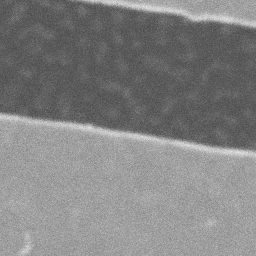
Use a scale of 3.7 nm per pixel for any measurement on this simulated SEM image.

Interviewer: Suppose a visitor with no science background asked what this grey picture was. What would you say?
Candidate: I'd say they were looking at one or a few lines or trenches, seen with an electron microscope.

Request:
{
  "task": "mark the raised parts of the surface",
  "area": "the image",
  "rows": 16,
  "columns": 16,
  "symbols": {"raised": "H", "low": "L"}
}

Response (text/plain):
LLLLLLLLLHHHHHHH
LLLLLLLLLLLLLLLH
LLLLLLLLLLLLLLLL
LLLLLLLLLLLLLLLL
LLLLLLLLLLLLLLLL
LLLLLLLLLLLLLLLL
LLLLLLLLLLLLLLLL
HHLLLLLLLLLLLLLL
HHHHHHHHHLLLLLLL
HHHHHHHHHHHHHHHL
HHHHHHHHHHHHHHHH
HHHHHHHHHHHHHHHH
HHHHHHHHHHHHHHHH
HHHHHHHHHHHHHHHH
HHHHHHHHHHHHHHHH
HHHHHHHHHHHHHHHH